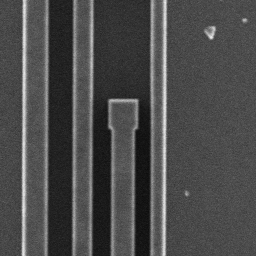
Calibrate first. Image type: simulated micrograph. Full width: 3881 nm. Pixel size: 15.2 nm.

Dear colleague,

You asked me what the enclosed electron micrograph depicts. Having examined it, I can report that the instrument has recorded groups of lines, slits or small figures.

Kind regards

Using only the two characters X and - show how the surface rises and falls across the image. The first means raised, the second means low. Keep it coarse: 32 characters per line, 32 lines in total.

---XXX---XXX-------XX-----------
---XXX---XXX-------XX-----------
---XXX---XXX-------XX-----------
---XXX---XXX-------XX-----------
---XXX---XXX-------XX-----------
---XXX---XXX-------XX-----------
---XXX---XXX-------XX-----------
---XXX---XXX-------XX-----------
---XXX---XXX-------XX-----------
---XXX---XXX-------XX-----------
---XXX---XXX-------XX-----------
---XXX---XX--------XX-----------
---XXX---XX--------XX-----------
---XXX---XX---XXX--XX-----------
---XXX---XX---XXX--XX-----------
---XXX---XX---XXX--XX-----------
---XXX---XX---XXX--XX-----------
---XXX---XX---XXX--XX-----------
---XXX---XX---XXX--XX-----------
---XXX---XX---XXX--XX-----------
---XXX---XX---XXX--XX-----------
---XXX---XX---XXX--XX-----------
---XXX---XX---XXX--XX-----------
---XXX---XX---XXX--XX-----------
---XXX---XX---XXX--XX-----------
---XXX---XX---XXX--XX-----------
---XXX---XX---XXX--XX-----------
---XXX---XX---XXX--XX-----------
---XXX---XX---XXX--XX-----------
---XXX---XX---XXX--XX-----------
---XXX---XX---XXX--XX-----------
---XXX---XX---XXX--XX-----------